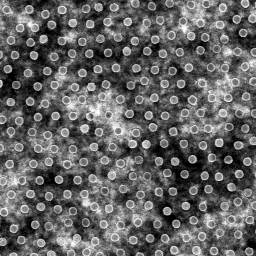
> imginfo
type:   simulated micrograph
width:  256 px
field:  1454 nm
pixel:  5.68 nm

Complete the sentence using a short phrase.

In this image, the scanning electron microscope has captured a regular array of raised bodies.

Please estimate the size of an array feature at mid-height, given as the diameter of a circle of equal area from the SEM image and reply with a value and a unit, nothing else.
46.2 nm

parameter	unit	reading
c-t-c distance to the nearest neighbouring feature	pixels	15.2